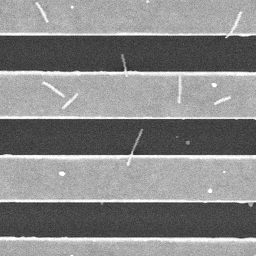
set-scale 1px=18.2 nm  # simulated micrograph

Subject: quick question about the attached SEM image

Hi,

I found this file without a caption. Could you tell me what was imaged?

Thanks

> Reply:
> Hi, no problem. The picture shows lines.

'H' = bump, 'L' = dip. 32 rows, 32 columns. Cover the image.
HHHHHHHHHHHHHHHHHHHHHHHHHHHHHHHH
HHHHHHHHHHHHHHHHHHHHHHHHHHHHHHHH
HHHHHHHHHHHHHHHHHHHHHHHHHHHHHHHH
HHHHHHHHHHHHHHHHHHHHHHHHHHHHHHHH
LLLLLLLLLLLLLLLLLLLLLLLLLLLLLLLL
LLLLLLLLLLLLLLLLLLLLLLLLLLLLLLLL
LLLLLLLLLLLLLLLLLLLLLLLLLLLLLLLL
LLLLLLLLLLLLLLLLLLLLLLLLLLLLLLLL
LLLLLLLLLLLLLLLLLLLLLLLLLLLLLLLL
HHHHHHHHHHHHHHHHHHHHHHHHHHHHHHHH
HHHHHHHHHHHHHHHHHHHHHHHHHHHHHHHH
HHHHHHHHHHHHHHHHHHHHHHHHHHHHHHHH
HHHHHHHHHHHHHHHHHHHHHHHHHHHHHHHH
HHHHHHHHHHHHHHHHHHHHHHHHHHHHHHHH
HHHHHHHHHHHHHHHHHHHHHHHHHHHHHHHH
LLLLLLLLLLLLLLLLLLLLLLLLLLLLLLLL
LLLLLLLLLLLLLLLLLLLLLLLLLLLLLLLL
LLLLLLLLLLLLLLLLLLLLLLLLLLLLLLLL
LLLLLLLLLLLLLLLLLLLLLLLLLLLLLLLL
HHHHHHHHHHHHHHHHHHHHHHHHHHHHHHHH
HHHHHHHHHHHHHHHHHHHHHHHHHHHHHHHH
HHHHHHHHHHHHHHHHHHHHHHHHHHHHHHHH
HHHHHHHHHHHHHHHHHHHHHHHHHHHHHHHH
HHHHHHHHHHHHHHHHHHHHHHHHHHHHHHHH
HHHHHHHHHHHHHHHHHHHHHHHHHHHHHHHH
LLLLLLLLLLLLLLLLLLLLLLLLLLLLLLLL
LLLLLLLLLLLLLLLLLLLLLLLLLLLLLLLL
LLLLLLLLLLLLLLLLLLLLLLLLLLLLLLLL
LLLLLLLLLLLLLLLLLLLLLLLLLLLLLLLL
LLLLLLLLLLLLLLLLLLLLLLLLLLLLLLLL
HHHHHHHHHHHHHHHHHHHHHHHHHHHHHHHH
HHHHHHHHHHHHHHHHHHHHHHHHHHHHHHHH